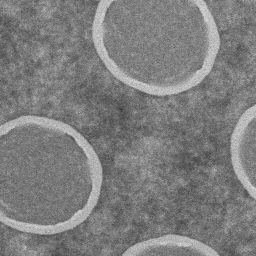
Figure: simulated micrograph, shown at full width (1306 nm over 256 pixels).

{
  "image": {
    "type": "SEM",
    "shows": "raised bodies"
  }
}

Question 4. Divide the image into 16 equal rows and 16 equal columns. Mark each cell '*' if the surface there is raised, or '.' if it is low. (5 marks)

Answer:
......*******...
......*******...
......*******...
.......******...
.......******...
.........**.....
................
...............*
*****..........*
******.........*
******.........*
******.........*
******..........
*****...........
................
.........****...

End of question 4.